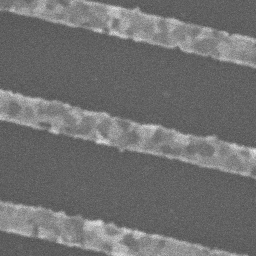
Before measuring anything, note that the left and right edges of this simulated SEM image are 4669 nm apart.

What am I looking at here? one or a few lines or trenches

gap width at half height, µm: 1.48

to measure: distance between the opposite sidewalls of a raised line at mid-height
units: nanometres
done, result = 467